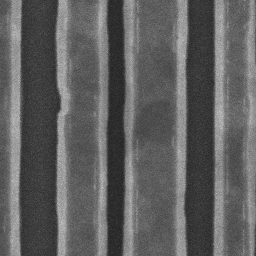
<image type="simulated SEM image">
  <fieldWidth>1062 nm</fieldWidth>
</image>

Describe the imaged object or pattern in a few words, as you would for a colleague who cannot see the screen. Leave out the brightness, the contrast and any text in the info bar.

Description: one or a few lines or trenches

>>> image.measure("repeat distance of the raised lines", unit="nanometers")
318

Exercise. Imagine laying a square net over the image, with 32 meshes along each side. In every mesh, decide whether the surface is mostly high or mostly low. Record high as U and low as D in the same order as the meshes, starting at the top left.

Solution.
UUDDDDDDUUUUUDDDUUUUUUUDDDDUUUUU
UUDDDDDDUUUUUDDDUUUUUUUDDDDUUUUU
UUDDDDDDUUUUUDDDUUUUUUUDDDDUUUUU
UUDDDDDDUUUUUDDDUUUUUUUDDDDUUUUU
UUDDDDDDUUUUUDDDUUUUUUUDDDDUUUUU
UUDDDDDDUUUUUDDDUUUUUUUDDDDUUUUD
UUDDDDDDUUUUUDDDUUUUUUUDDDDUUUUD
UUDDDDDDUUUUUDDDUUUUUUUDDDDUUUUU
UUDDDDDDUUUUUDDDUUUUUUUDDDDUUUUU
UUDDDDDDUUUUUDDDUUUUUUUDDDDUUUUU
UUDDDDDDUUUUUDDDUUUUUUUDDDDUUUUU
UUDDDDDDUUUUUDDDUUUUUUUDDDDUUUUU
UUDDDDDDUUUUUDDDUUUUUUUDDDDUUUUU
UUDDDDDDUUUUUDDDUUUUUUUDDDDUUUUU
UUDDDDDDUUUUUDDDUUUUUUUDDDDUUUUU
UUDDDDDDUUUUUDDDUUUUUUUDDDDUUUUU
UUDDDDDDUUUUUDDDUUUUUUUDDDDUUUUU
UUDDDDDDUUUUUDDDUUUUUUUDDDDUUUUU
UUDDDDDDUUUUUDDDUUUUUUUDDDDUUUUU
UUDDDDDDUUUUUDDDUUUUUUUDDDDUUUUU
UUDDDDDDUUUUUDDDUUUUUUUDDDDUUUUU
UUDDDDDDUUUUUDDDUUUUUUUDDDDUUUUU
UUDDDDDDUUUUUDDDUUUUUUUDDDDUUUUU
UUDDDDDDUUUUUDDDUUUUUUUDDDDUUUUU
UUDDDDDDUUUUUDDDUUUUUUUDDDDUUUUU
UUDDDDDDUUUUUDDDUUUUUUUDDDDUUUUU
UUDDDDDDUUUUUDDDUUUUUUUDDDDUUUUD
UUDDDDDDUUUUUDDDUUUUUUUDDDDUUUUD
UUDDDDDDUUUUUDDDUUUUUUUDDDDUUUUU
UUDDDDDDUUUUUDDDUUUUUUUDDDDUUUUU
UUDDDDDDUUUUUDDDUUUUUUUDDDDUUUUU
UUDDDDDDUUUUUDDDUUUUUUUDDDDUUUUU